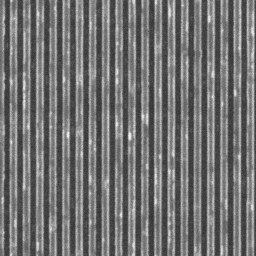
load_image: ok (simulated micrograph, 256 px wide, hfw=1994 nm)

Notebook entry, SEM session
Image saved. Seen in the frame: parallel lines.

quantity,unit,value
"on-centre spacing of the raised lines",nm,103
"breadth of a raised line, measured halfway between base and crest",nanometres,50.7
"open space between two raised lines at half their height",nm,50.7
